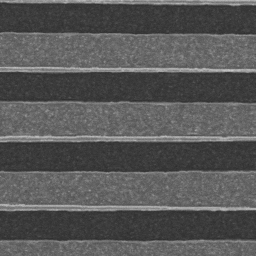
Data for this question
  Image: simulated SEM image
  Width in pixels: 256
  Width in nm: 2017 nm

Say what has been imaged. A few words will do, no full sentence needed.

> lines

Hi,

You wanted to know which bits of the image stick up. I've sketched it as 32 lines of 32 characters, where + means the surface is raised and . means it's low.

............................++++
................................
................................
................................
++++++++++++++++++++++++++++++++
++++++++++++++++++++++++++++++++
++++++++++++++++++++++++++++++++
++++++++++++++++++++++++++++++++
++++++++++++++++++++++++++++++++
................................
................................
................................
................................
++++++++++++++++++++++++++++++++
++++++++++++++++++++++++++++++++
++++++++++++++++++++++++++++++++
++++++++++++++++++++++++++++++++
++++++++++++++++++++++++++++++..
................................
................................
................................
+..+++..+++++.........+++++.++++
++++++++++++++++++++++++++++++++
++++++++++++++++++++++++++++++++
++++++++++++++++++++++++++++++++
++++++++++++++++++++++++++++++++
................................
................................
................................
................................
++++++++++++++++++++++++++++++++
++++++++++++++++++++++++++++++++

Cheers